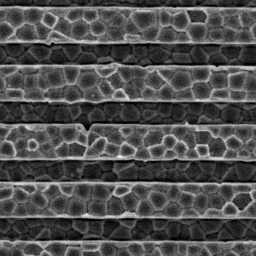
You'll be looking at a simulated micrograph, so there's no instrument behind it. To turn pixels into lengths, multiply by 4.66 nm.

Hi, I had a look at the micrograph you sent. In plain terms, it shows parallel lines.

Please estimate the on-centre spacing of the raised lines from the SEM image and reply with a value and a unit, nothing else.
0.272 um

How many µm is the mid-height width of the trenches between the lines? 0.108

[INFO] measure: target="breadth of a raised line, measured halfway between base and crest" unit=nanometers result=166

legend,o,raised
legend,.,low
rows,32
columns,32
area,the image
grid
................................
oooooooooooooooooooooooooooooooo
oooooooooooooooooooooooooooooooo
oooooooooooooooooooooooooooooooo
oooooooooooooooooooooooooooooooo
................................
................................
................................
oooooooooooooooooooooooooooooooo
oooooooooooooooooooooooooooooooo
oooooooooooooooooooooooooooooooo
oooooooooooooooooooooooooooooooo
oooooooooooooooooooooooooooooooo
................................
................................
....o....o......................
oooooooooooooooooooooooooooooooo
oooooooooooooooooooooooooooooooo
oooooooooooooooooooooooooooooooo
oooooooooooooooooooooooooooooooo
................................
................................
................................
oooooooooooooooooooooooooooooooo
oooooooooooooooooooooooooooooooo
oooooooooooooooooooooooooooooooo
oooooooooooooooooooooooooooooooo
................................
................................
................................
oooooooooooooooooooooooooooooooo
oooooooooooooooooooooooooooooooo